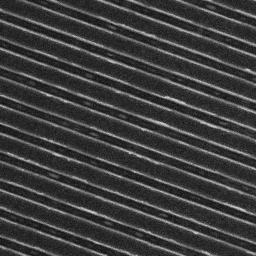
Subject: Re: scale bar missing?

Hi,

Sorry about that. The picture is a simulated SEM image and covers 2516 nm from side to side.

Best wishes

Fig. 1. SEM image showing parallel lines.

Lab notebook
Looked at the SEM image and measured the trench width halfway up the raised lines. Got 81 nm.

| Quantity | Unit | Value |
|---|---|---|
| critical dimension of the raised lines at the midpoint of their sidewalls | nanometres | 179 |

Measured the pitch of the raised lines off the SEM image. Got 0.261 microns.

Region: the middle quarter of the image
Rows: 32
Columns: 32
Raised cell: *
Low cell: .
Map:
...*************......**********
......*************......*******
**......**************......****
*****......**************......*
*******.......*************.....
***********......*************..
*************......*************
...*************......**********
.....**************......*******
*.......**************......****
****.......*************.......*
*******.......*************.....
**********.......*************..
*************......*************
...************.......**********
.....*************.......*******
**......*************.......****
****.......*************......**
*******.......************......
**********......*************...
************.......*************
..*************.......**********
.....*************.......*******
*.......*************.......****
****.......*************......**
*******.......************......
**********......*************...
************.......*************
..*************.......**********
.....*************......********
**......*************......*****
****.......************.......**